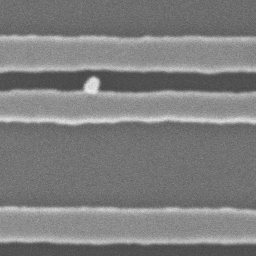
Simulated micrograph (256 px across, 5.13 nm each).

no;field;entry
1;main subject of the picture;lines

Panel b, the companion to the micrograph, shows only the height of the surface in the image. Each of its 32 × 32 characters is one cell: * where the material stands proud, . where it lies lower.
................................
................................
................................
................................
................................
********************************
********************************
********************************
********************************
................................
...........*....................
.************.......**.*........
********************************
********************************
********************************
........**......................
................................
................................
................................
................................
................................
................................
................................
................................
................................
................................
********************************
********************************
********************************
********************************
...........***...**.........*...
................................